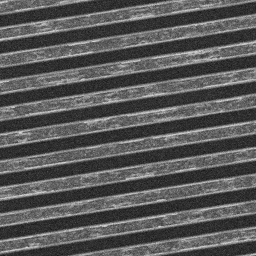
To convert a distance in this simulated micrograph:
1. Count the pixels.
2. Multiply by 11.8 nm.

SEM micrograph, parallel lines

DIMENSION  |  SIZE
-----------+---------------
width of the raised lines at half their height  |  13 pixels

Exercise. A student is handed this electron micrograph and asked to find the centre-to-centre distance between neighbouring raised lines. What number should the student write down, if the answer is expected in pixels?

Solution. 26.2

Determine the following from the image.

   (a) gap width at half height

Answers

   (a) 0.164 microns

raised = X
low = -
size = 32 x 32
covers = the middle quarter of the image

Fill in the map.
--------XXXXXXXXXXXXXXXXXXX-----
--XXXXXXXXXXXXXXXXXXX-----------
XXXXXXXXXXXXXX------------------
XXXXXXXX------------------------
XXX----------------------XXXXXXX
------------------XXXXXXXXXXXXXX
------------XXXXXXXXXXXXXXXXXXXX
------XXXXXXXXXXXXXXXXXXXX------
XXXXXXXXXXXXXXXXXXX-------------
XXXXXXXXXXXXX-------------------
XXXXXXX-----------------------XX
-----------------------XXXXXXXXX
-----------------XXXXXXXXXXXXXXX
-----------XXXXXXXXXXXXXXXXXX---
----XXXXXXXXXXXXXXXXXXX---------
XXXXXXXXXXXXXXXXX---------------
XXXXXXXXXX----------------------
XXXX-----------------------XXXXX
---------------------XXXXXXXXXXX
--------------XXXXXXXXXXXXXXXXXX
--------XXXXXXXXXXXXXXXXXXX-----
--XXXXXXXXXXXXXXXXXX------------
XXXXXXXXXXXXXX------------------
XXXXXXXXX-----------------------
XXX-----------------------XXXXXX
-------------------XXXXXXXXXXXXX
-------------XXXXXXXXXXXXXXXXXXX
-------XXXXXXXXXXXXXXXXXX-------
XXXXXXXXXXXXXXXXXXX-------------
XXXXXXXXXXXXX-------------------
XXXXXX-----------------------XXX
-----------------------XXXXXXXXX